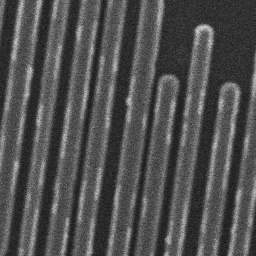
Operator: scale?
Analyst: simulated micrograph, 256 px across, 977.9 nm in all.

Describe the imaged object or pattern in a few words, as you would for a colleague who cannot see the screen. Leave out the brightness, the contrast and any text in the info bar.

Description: parallel lines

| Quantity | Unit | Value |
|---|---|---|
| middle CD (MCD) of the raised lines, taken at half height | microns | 0.0695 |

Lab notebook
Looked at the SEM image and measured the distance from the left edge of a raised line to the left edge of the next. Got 115 nanometres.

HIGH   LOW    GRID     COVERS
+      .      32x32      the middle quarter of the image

..+++++..++++....+++++..........
..+++++..++++....+++++..........
..++++...++++....+++++..........
..++++..+++++....+++++...++....+
..++++..++++.....+++++..++++...+
..++++..++++.....+++++..++++...+
..++++..++++....++++++..++++...+
.+++++..++++....++++++.+++++...+
.+++++..++++....+++++..+++++...+
.+++++..++++...++++++..+++++...+
.++++..+++++....+++++..+++++..++
.++++..+++++....+++++..+++++..++
.++++..+++++....+++++..++++...++
+++++..++++.....+++++..++++...++
+++++..++++.....+++++..++++...++
+++++..++++.....++++..+++++...++
++++...++++....+++++..+++++...++
++++..+++++....+++++..+++++...++
++++..+++++....+++++..+++++..+++
++++..+++++....+++++..+++++..+++
++++..++++.....+++++..++++...+++
++++..++++.....+++++..++++...+++
++++..++++....+++++..+++++...+++
+++...++++....+++++..+++++...+++
+++..+++++....+++++..+++++...+++
+++..+++++....+++++..++++....+++
+++..+++++....+++++..++++...++++
+++..++++.....+++++..++++...++++
+++..++++.....+++++..++++...++++
++...++++....++++++.+++++...++++
++...++++....+++++..+++++...++++
++..+++++....+++++..+++++...++++